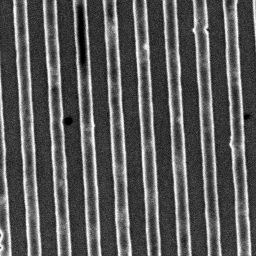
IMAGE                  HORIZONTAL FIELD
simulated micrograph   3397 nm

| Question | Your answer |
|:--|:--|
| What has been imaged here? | parallel lines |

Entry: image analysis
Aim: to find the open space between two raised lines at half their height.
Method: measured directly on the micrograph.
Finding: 230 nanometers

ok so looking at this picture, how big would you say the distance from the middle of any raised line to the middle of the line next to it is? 29.9 px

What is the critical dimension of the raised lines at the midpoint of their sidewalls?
167 nanometres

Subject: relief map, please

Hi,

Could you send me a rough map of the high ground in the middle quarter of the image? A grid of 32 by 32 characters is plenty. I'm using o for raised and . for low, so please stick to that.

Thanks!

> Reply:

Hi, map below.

...ooo.....ooo....ooo.....ooo...
...ooo.....ooo....ooo.....ooo...
....oo.....ooo.....oo.....ooo...
....ooo....ooo.....ooo....ooo...
....ooo....ooo.....ooo....ooo...
....ooo....ooo.....ooo....ooo...
....ooo....ooo.....ooo....ooo...
....ooo....ooo.....ooo....ooo...
....ooo....ooo.....ooo....ooo...
....ooo....ooo.....ooo....ooo...
....ooo....ooo.....ooo....ooo...
....ooo.....oo.....ooo.....oo...
....ooo.....ooo....ooo.....ooo..
....ooo.....ooo....ooo.....ooo..
....ooo.....ooo....ooo.....ooo..
....ooo.....ooo....ooo.....ooo..
....ooo.....ooo....ooo.....ooo..
....ooo.....ooo....ooo.....ooo..
....ooo.....ooo....ooo.....ooo..
.....oo.....ooo.....oo.....ooo..
.....ooo....ooo.....ooo....ooo..
.....ooo....ooo.....ooo....ooo..
.....ooo....ooo.....ooo....ooo..
.....ooo....ooo.....ooo....ooo..
.....ooo....ooo.....ooo....ooo..
.....ooo....ooo.....ooo....ooo..
.....ooo....ooo.....ooo....ooo..
.....ooo....ooo.....ooo....ooo..
.....ooo.....oo.....ooo.....oo..
o....ooo.....ooo....ooo.....ooo.
o....ooo.....ooo....ooo.....ooo.
o....ooo.....ooo....ooo.....ooo.